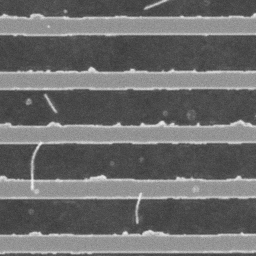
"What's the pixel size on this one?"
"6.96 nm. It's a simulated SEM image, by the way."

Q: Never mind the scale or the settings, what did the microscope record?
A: lines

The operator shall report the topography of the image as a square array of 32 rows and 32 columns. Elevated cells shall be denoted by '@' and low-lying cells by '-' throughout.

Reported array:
--------------------------------
--------------------------------
@@@@@@@@@@@@@@@@@@@@@@@@@@@@@@@@
@@@@@@@@@@@@@@@@@@@@@@@@@@@@@@@@
--------------------------------
--------------------------------
--------------------------------
--------------------------------
--------------------------------
@@@@@@@@@@@@@@@@@@@@@@@@@@@@@@@@
@@@@@@@@@@@@@@@@@@@@@@@@@@@@@@@@
--------------------------------
--------------------------------
--------------------------------
--------------------------------
@-----@-------------@--------@@-
@@@@@@@@@@@@@@@@@@@@@@@@@@@@@@@@
@@@@@@@@@@@@@@@@@@@@@@@@@@@@@@@@
--------------------------------
--------------------------------
--------------------------------
--------------------------------
@@@@@------@@@@@@-----@@@@--@@@@
@@@@@@@@@@@@@@@@@@@@@@@@@@@@@@@@
@@@@@@@@@@@@@@@@@@@@@@@@@@@@@@@@
--------------------------------
--------------------------------
--------------------------------
--------------------------------
@@@@@@@@@@@@@@@@@@@@@@@@@@@@@@@@
@@@@@@@@@@@@@@@@@@@@@@@@@@@@@@@@
@@@@@@@@@@@@@@@@@@@@@@@@@@@@@-@@